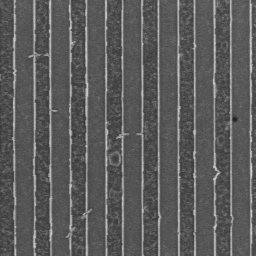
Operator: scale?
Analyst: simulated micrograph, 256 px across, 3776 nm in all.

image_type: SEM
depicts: parallel lines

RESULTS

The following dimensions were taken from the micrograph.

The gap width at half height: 280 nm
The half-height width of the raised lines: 242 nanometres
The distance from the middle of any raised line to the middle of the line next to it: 532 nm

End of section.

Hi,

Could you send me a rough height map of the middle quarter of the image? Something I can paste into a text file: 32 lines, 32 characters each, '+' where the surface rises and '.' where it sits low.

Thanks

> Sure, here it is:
..++++.....+++......++++.....+++
..++++.....+++......++++.....+++
..++++.....+++......++++.....+++
..++++....++++......++++.....+++
..++++.....+++......++++.....+++
..++++.....+++......++++.....+++
..++++.....+++......++++.....+++
..++++.....+++.....+++++.....+++
..++++.....+++......++++.....+++
..++++.....+++......++++.....+++
..++++.....+++......++++.....+++
..++++.....+++......++++.....+++
..++++.....+++......++++.....+++
..++++.....+++......++++.....+++
..++++.....++++.....++++.....+++
..++++.....++++.....++++.....+++
..++++.....++++.....++++.....+++
..++++.....++++....+++++.....+++
..++++.....++++.....++++.....+++
..++++.....++++.....++++.....+++
..++++.....++++.....++++.....+++
..++++.....++++.....++++.....+++
..+++......++++.....++++.....+++
..++++.....++++.....++++.....+++
..++++.....++++.....++++.....+++
..++++....+++++.....++++.....+++
..+++......++++.....++++.....+++
..+++......++++.....++++.....+++
..+++......++++.....++++.....+++
..+++.....+++++.....++++.....+++
..+++.....+++++.....++++.....+++
..+++.....+++++.....++++.....+++